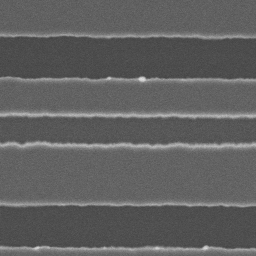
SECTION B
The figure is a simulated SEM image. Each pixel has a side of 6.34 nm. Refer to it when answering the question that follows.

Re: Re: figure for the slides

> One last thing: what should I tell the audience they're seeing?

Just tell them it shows lines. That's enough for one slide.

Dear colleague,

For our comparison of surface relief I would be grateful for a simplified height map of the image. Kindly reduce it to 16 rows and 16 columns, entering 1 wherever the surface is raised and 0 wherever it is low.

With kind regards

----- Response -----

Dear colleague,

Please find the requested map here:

1111111111111111
1111111111111111
0000000000000000
0000000000000000
0000000000000000
1111111111111111
1111111111111111
1111111111111111
1111111111111111
1111111111111111
1111111111111111
1111111111111111
1111111111111111
0000000000000000
0000000000000000
1111000001000100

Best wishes